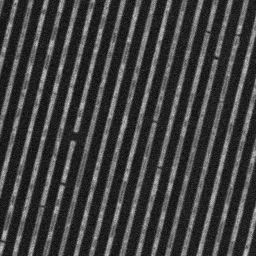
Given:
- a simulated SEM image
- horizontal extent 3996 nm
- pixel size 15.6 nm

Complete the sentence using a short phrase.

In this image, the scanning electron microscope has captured parallel lines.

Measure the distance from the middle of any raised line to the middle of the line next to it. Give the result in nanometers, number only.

233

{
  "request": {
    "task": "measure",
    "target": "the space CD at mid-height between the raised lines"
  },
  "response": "184 nm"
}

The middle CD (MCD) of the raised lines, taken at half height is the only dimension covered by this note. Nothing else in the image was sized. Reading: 43.6 nm